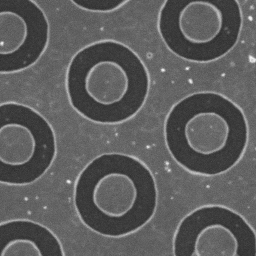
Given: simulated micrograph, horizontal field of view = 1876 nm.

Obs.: ring-shaped grooves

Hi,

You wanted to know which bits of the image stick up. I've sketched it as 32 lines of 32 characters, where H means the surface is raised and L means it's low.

LLLLHHHHHHLLLLLHHHHHHLLLHHLLLLHH
LLLLLHHHHHHHHHHHHHHHLLLHHHHLLLHH
HHHLLLHHHHHHHHHHHHHHLLHHHHHHLLHH
HHHLLLHHHHHHHHHHHHHHLLLHHHHHLLHH
HHHLLLHHHHHHHHHHHHHHLLLHHHHLLLHH
HHHLLLHHHHHHLLLHHHHHHLLLLLLLLHHH
HLLLLHHHHHLLLLLLLHHHHHLLLLLLHHHH
LLLLLHHHHLLLLLLLLHHHHHHHLLHHHHHH
LLLHHHHHHLLLHHHLLLHHHHHHHHHHHHHH
HHHHHHHHLLLHHHHHLLHHHHHHHHHHHHHH
HHHHHHHHLLLHHHHHLLLHHHHHHHHHHHHH
HHHHHHHHHLLHHHHHLLHHHHHHHHHHHHHH
HHHHHHHHHLLLHHHLLLHHHHHLLLLLHHHH
LLLLHHHHHLLLLLLLLHHHHHLLLLLLLLHH
LLLLLHHHHHHLLLLLHHHHHLLLLHHLLLHH
LLLLLLHHHHHHHHHHHHHHHLLHHHHHLLLH
HHHHLLLHHHHHHHHHHHHHHLLHHHHHLLLH
HHHHLLLHHHHHHHHHHHHHHLLHHHHHLLLH
HHHHLLLHHHHHHHHHHHHHHLLLHHHHLLLH
HHHHLLLHHHHHHLLLHHHHHHLLLLLLLLHH
LHHLLLHHHHHLLLLLLLHHHHHLLLLLLHHH
LLLLLHHHHHLLLLLLLLLHHHHHHLLLHHHH
LLLLHHHHHHLLLHHHLLLHHHHHHHHHHHHH
HHHHHHHHHHLLHHHHHLLHHHHHHHHHHHHH
HHHHHHHHHLLLHHHHHLLLHHHHHHHHHHHH
HHHHHHHHHLLLHHHHHLLHHHHHHHHHHHHH
HHHHHHHHHHLLLHHHLLLHHHHHLLLLLHHH
HHHHHHHHHHLLLLLLLLHHHHHLLLLLLLHH
LLLLLLHHHHHLLLLLLHHHHHLLLLHHLLLH
LLLLLLLHHHHHHHHHHHHHHHLLLHHHHLLL
LHHHLLLHHHHHHHHHHHHHHHLLHHHHHHLL
HHHHHLLLHHHHHHHHHHHHHHLLLHHHHLLL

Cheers